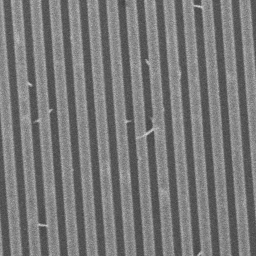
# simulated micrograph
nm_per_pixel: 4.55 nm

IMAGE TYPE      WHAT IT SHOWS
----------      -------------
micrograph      parallel lines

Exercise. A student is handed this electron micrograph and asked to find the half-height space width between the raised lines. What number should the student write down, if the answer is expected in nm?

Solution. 34.6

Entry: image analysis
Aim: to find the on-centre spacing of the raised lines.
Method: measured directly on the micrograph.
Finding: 86.3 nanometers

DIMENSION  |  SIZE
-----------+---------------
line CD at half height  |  49.9 nanometres